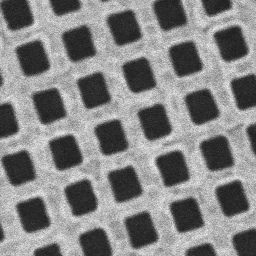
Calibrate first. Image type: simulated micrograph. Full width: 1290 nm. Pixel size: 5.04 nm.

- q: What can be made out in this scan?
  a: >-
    a regular array of holes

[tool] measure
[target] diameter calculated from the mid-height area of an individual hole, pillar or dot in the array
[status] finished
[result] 33.7 px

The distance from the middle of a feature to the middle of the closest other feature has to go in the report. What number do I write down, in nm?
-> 242